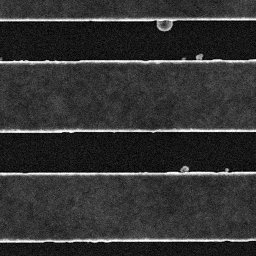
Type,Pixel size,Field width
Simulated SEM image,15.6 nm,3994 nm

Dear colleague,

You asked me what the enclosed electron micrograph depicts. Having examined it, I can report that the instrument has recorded lines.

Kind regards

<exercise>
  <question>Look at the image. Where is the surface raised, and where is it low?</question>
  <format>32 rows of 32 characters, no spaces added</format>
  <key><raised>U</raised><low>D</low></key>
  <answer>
UUUUUUUUUUUUUUUUUUUUUUUUUUUUUUUU
UUUUUUUUUUUUUUUUUUUUUUUUUUUUUUUU
UUUUUUUUUUUUUUUUUUUDDUDDDDDDDDDD
DDDDDDDDDDDDDDDDDDDDDDDDDDDDDDDD
DDDDDDDDDDDDDDDDDDDDDDDDDDDDDDDD
DDDDDDDDDDDDDDDDDDDDDDDDDDDDDDDD
DDDDDDDDDDDDDDDDDDDDDDDDDDDDDDDD
DDDDDDDDDDDDDDDDDDDDDDDDDDDDDDDD
UUUUUUUUUUUUUUUUUUUUUUUUUUUUUUUU
UUUUUUUUUUUUUUUUUUUUUUUUUUUUUUUU
UUUUUUUUUUUUUUUUUUUUUUUUUUUUUUUU
UUUUUUUUUUUUUUUUUUUUUUUUUUUUUUUU
UUUUUUUUUUUUUUUUUUUUUUUUUUUUUUUU
UUUUUUUUUUUUUUUUUUUUUUUUUUUUUUUU
UUUUUUUUUUUUUUUUUUUUUUUUUUUUUUUU
UUUUUUUUUUUUUUUUUUUUUUUUUUUUUUUU
UUUUUUUUDDDDDDDDDDDDDDDDDDDDDDDD
DDDDDDDDDDDDDDDDDDDDDDDDDDDDDDDD
DDDDDDDDDDDDDDDDDDDDDDDDDDDDDDDD
DDDDDDDDDDDDDDDDDDDDDDDDDDDDDDDD
DDDDDDDDDDDDDDDDDDDDDDDDDDDDDDDD
DDDDDDDDDDDDDDDDDDDDDDDDDDDDDDDD
UUUUUUUUUUUUUUUUUUUUUUUUUUUUUUUU
UUUUUUUUUUUUUUUUUUUUUUUUUUUUUUUU
UUUUUUUUUUUUUUUUUUUUUUUUUUUUUUUU
UUUUUUUUUUUUUUUUUUUUUUUUUUUUUUUU
UUUUUUUUUUUUUUUUUUUUUUUUUUUUUUUU
UUUUUUUUUUUUUUUUUUUUUUUUUUUUUUUU
UUUUUUUUUUUUUUUUUUUUUUUUUUUUUUUU
UUUUUUUUUUUUUUUUUUUUUUUUUUUUUUUU
DDDDDDDDDDDDDDDDDDDDDDDDDDDDDDDD
DDDDDDDDDDDDDDDDDDDDDDDDDDDDDDDD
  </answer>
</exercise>